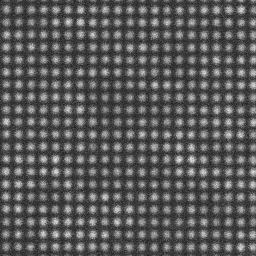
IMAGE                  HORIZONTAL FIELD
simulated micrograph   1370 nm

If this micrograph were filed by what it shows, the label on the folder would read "a regular array of raised bodies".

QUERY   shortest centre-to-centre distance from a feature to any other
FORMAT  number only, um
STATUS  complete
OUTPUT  0.0651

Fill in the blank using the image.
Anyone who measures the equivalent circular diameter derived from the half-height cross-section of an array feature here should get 0.0336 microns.